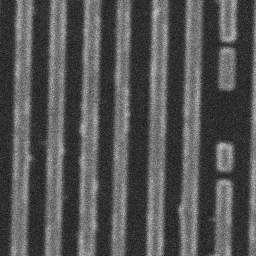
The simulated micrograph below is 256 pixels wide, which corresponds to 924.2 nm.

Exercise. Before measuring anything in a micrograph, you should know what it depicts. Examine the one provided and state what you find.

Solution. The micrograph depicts parallel lines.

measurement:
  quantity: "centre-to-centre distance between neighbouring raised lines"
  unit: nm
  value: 122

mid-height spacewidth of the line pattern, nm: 71.3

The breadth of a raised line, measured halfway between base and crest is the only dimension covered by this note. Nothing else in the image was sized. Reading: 53.7 nm